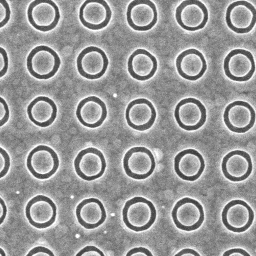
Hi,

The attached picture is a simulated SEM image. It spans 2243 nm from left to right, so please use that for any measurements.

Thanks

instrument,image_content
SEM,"a regular array of ring-shaped grooves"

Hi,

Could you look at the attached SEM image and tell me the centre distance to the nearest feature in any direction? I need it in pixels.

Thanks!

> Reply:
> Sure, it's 48.7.